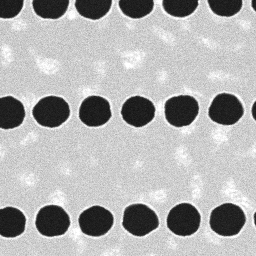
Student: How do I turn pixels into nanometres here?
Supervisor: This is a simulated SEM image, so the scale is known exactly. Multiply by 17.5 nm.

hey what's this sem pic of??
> a regular array of holes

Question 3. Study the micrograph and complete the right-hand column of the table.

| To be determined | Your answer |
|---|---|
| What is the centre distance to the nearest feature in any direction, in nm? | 765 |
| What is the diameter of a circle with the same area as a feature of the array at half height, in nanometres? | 596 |